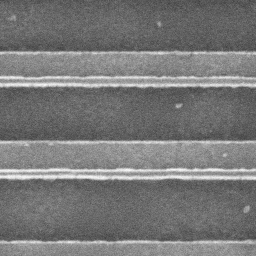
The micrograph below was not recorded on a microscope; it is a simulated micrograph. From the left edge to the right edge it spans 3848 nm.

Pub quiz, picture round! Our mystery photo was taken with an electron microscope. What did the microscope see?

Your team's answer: lines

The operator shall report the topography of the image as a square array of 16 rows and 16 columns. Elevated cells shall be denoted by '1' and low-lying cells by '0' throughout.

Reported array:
0000000000000000
0000000000000000
0000000000000000
1111111111111111
1111111111111111
0000000000000000
0000000000000000
0000000000000000
0000000000000000
1111111111111111
1111111111111111
0000000000000000
0000000000000000
0000000000000000
0000000000000000
1111111111111111